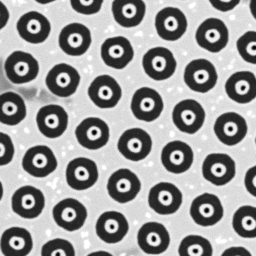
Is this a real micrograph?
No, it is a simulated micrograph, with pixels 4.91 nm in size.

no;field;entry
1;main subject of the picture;a regular array of ring-shaped grooves with a dot in the middle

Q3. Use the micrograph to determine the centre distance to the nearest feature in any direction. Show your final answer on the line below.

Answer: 41.9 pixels